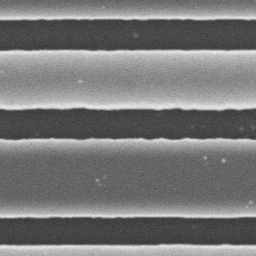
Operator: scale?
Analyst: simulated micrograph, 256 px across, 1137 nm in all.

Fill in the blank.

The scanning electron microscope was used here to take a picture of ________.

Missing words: lines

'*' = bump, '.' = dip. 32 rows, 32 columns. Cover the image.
********************************
********************************
................................
................................
................................
................................
********************************
********************************
********************************
********************************
********************************
********************************
********************************
*****..**..******.****.********.
................................
................................
................................
*.*******************.**********
********************************
********************************
********************************
********************************
********************************
********************************
********************************
********************************
********************************
................................
................................
................................
................................
********************************